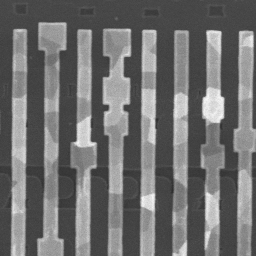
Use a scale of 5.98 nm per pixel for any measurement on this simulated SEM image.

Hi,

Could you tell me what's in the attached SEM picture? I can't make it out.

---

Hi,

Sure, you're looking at wiring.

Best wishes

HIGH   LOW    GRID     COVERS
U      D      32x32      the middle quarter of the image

DDDDUUUDDDDDUUUDDDDDUUUDDDDDUUUD
DDDDUUUDDDDDUUUDDDDDUUUDDDDDUUUD
DDDDUUUDDDDDUUUDDDDDUUUDDDDDUUUD
DDDDUUUDDDDUUUUDDDDDUUUDDDDDUUUD
DDDDUUUDDDUUUUUUDDDDUUUDDDDDUUUD
DDDDUUUDDDUUUUUUDDDDUUUDDDDDUUUD
DDDDUUUDDDUUUUUUDDDDUUUDDDDDUUUD
DDDDUUUDDDUUUUUUDDDDUUUDDDDDUUUD
DDDDUUUDDDUUUUUUDDDDUUUDDDDDUUUD
DDDDUUUDDDUUUUUUDDDDUUUDDDDDUUUD
DDDDUUUDDDDUUUUDDDDDUUDDDDDDUUUD
DDDDUUUDDDDUUUUDDDDDUUDDDDDDUUUD
DDDDUUUDDDUUUUUUDDDDUUDDDDDDUUUD
DDDDUUUDDDUUUUUUDDDDUUDDDDDDUUUD
DDDDUUUDDDUUUUUUDDDDUUDDDDDDUUUD
DDDDUUDDDDUUUUUUDDDDUUUDDDDDUUUD
DDDDUUDDDDUUUUUUDDDDUUUDDDDDUUUD
DDDDUUDDDDDUUUUUDDDDUUDDDDDDUUUD
DDDDUUDDDDDUUUUDDDDDUUDDDDDDUUUD
DDDUUUUDDDDUUUUDDDDDUUDDDDDDUUUD
DDUUUUUUDDDUUUDDDDDDUUDDDDDDUUUD
DDUUUUUUDDDUUUDDDDDDUUDDDDDDUUUD
DDUUUUUUDDDUUUDDDDDDUUDDDDDDUUUD
DDUUUUUUDDDUUUDDDDDDUUDDDDDDUUUD
DDUUUUUUDDDUUUDDDDDDUUDDDDDDUUUD
DDUUUUUUDDDUUUDDDDDDUUDDDDDDUUUD
DDDUUUDDDDDUUUDDDDDDUUDDDDDDUUUD
DDDUUUDDDDDUUUDDDDDDUUDDDDDDUUUD
DDDUUUDDDDDUUUDDDDDDUUDDDDDDUUUD
DDDUUUDDDDDUUUDDDDDDUUDDDDDDUUUD
DDDUUUDDDDDDUUDDDDDDUUDDDDDDUUUD
DDDUUUDDDDDUUUDDDDDDUUDDDDDDUUUD